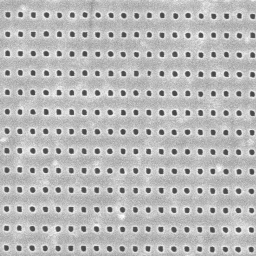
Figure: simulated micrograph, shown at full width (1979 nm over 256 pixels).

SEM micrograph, a regular array of holes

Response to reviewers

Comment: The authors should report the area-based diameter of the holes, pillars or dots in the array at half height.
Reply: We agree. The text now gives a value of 45.3 nm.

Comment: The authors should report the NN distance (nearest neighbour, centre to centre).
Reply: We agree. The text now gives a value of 12.7 px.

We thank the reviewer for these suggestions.